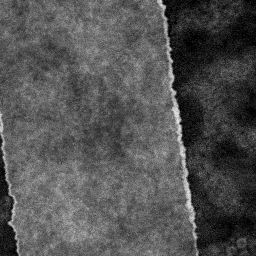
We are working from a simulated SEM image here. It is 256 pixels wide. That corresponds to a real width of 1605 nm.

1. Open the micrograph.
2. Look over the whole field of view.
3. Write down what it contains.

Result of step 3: one or a few lines or trenches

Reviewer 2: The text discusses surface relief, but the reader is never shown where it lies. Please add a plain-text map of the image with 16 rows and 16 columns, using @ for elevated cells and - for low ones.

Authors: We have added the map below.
@@@@@@@@@@------
@@@@@@@@@@------
@@@@@@@@@@@-----
@@@@@@@@@@@-----
@@@@@@@@@@@-----
@@@@@@@@@@@-----
@@@@@@@@@@@-----
@@@@@@@@@@@-----
@@@@@@@@@@@-----
@@@@@@@@@@@@----
@@@@@@@@@@@@----
-@@@@@@@@@@@----
-@@@@@@@@@@@----
-@@@@@@@@@@@----
-@@@@@@@@@@@----
-@@@@@@@@@@@----